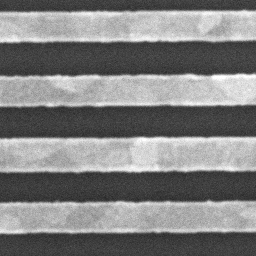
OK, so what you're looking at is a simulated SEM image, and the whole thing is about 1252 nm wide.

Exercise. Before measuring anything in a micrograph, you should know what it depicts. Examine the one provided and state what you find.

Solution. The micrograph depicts lines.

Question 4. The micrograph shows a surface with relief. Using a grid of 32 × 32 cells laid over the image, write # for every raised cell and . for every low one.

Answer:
................................
...................#############
################################
################################
################################
................................
................................
................................
................................
...........#...##########.######
################################
################################
################################
................................
................................
................................
................................
################################
################################
################################
################################
................................
................................
................................
................................
################################
################################
################################
################################
................................
................................
................................